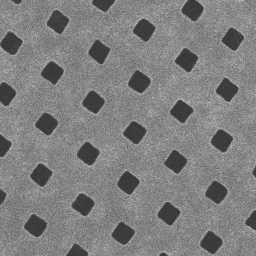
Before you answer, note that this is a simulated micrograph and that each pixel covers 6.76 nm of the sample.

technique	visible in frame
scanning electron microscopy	a regular array of holes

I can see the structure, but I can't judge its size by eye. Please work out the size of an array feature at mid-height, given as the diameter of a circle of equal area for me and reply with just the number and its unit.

138 nm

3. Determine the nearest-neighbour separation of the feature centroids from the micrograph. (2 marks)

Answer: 340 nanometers